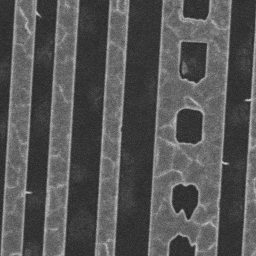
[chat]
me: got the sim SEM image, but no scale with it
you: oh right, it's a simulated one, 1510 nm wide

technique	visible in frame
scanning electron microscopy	parallel lines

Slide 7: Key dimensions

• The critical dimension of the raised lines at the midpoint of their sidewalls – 124 nm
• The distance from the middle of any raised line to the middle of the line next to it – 284 nm